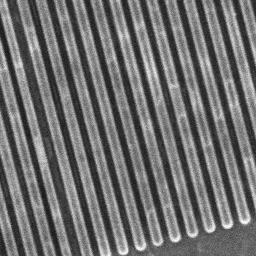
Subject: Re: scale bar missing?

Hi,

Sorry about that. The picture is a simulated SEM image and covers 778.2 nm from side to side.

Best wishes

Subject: parallel lines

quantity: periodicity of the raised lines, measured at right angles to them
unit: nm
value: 54.7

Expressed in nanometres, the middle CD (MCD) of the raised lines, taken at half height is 29.1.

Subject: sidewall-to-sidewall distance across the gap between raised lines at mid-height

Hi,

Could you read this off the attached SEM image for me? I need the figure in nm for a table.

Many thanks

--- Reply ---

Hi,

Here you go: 23.2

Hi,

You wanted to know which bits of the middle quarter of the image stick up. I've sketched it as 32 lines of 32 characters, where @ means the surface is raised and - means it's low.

--@@--@@@--@@@--@@--@@@--@@--@@@
--@@---@@--@@@--@@--@@@--@@@--@@
--@@@--@@--@@@--@@@--@@--@@@--@@
---@@--@@@--@@--@@@--@@@--@@--@@
@--@@---@@--@@@--@@--@@@--@@@--@
@--@@@--@@--@@@--@@--@@@--@@@--@
@--@@@--@@--@@@--@@@--@@--@@@--@
@---@@--@@@--@@--@@@--@@@--@@--@
@@--@@---@@--@@@--@@--@@@--@@@--
@@--@@@--@@--@@@--@@---@@--@@@--
@@--@@@--@@--@@@--@@@--@@--@@@--
@@---@@--@@@--@@--@@@--@@@--@@--
@@@--@@---@@--@@@--@@--@@@--@@@-
-@@--@@@--@@--@@@--@@@--@@--@@@-
-@@--@@@--@@--@@@--@@@--@@--@@@-
-@@---@@--@@@--@@--@@@--@@@--@@-
-@@@--@@---@@--@@@--@@--@@@--@@@
--@@--@@@--@@--@@@--@@@--@@--@@@
--@@--@@@--@@---@@--@@@--@@--@@@
--@@---@@--@@@--@@--@@@--@@@--@@
--@@@--@@---@@--@@@--@@--@@@--@@
---@@--@@@--@@--@@@--@@@--@@--@@
@--@@--@@@--@@@--@@--@@@--@@--@@
@--@@---@@--@@@--@@--@@@--@@@--@
@--@@@--@@---@@--@@@--@@--@@@--@
@---@@--@@@--@@--@@@--@@@--@@--@
@@--@@---@@--@@@--@@--@@@--@@---
@@--@@---@@--@@@--@@--@@@--@@@--
@@--@@@--@@---@@--@@@--@@--@@@--
@@---@@--@@@--@@--@@@--@@@--@@--
@@@--@@---@@--@@@--@@--@@@--@@@-
@@@--@@@--@@--@@@--@@--@@@--@@@-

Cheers